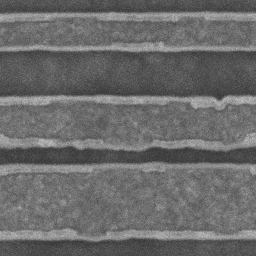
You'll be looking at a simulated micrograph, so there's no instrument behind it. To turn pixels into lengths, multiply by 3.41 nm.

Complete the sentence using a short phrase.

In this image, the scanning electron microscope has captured one or a few lines or trenches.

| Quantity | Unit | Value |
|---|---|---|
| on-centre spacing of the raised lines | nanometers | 290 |